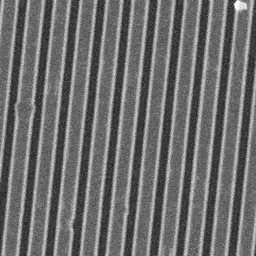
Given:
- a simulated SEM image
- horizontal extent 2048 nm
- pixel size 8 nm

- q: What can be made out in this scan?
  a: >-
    parallel lines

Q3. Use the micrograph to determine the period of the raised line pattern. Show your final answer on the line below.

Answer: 0.208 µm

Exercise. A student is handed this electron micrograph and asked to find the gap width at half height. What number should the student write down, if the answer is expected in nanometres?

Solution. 86.5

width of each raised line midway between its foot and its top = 123 nanometres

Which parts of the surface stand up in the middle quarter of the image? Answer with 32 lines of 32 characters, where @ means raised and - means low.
--@@@@---@@@@---@@@---@@@@---@@@
--@@@@---@@@@---@@@---@@@@---@@@
--@@@@---@@@@--@@@@---@@@@--@@@@
--@@@@---@@@---@@@@---@@@@--@@@@
--@@@@---@@@---@@@@---@@@---@@@@
--@@@@---@@@---@@@@---@@@---@@@@
--@@@@--@@@@---@@@@---@@@---@@@@
--@@@---@@@@---@@@@---@@@---@@@@
--@@@---@@@@---@@@@--@@@@---@@@-
--@@@---@@@@---@@@---@@@@---@@@-
-@@@@---@@@@---@@@---@@@@---@@@-
-@@@@---@@@@---@@@---@@@@---@@@-
-@@@@---@@@@--@@@@---@@@---@@@@-
-@@@@---@@@---@@@@---@@@---@@@@-
-@@@@---@@@---@@@@---@@@---@@@@-
-@@@@---@@@---@@@@---@@@---@@@@-
-@@@@--@@@@---@@@@---@@@---@@@@-
-@@@---@@@@---@@@@--@@@@---@@@@-
-@@@---@@@@---@@@---@@@@---@@@--
-@@@---@@@@---@@@---@@@@---@@@--
-@@@---@@@@---@@@---@@@@---@@@--
-@@@---@@@@--@@@@---@@@@--@@@@--
@@@@---@@@---@@@@---@@@---@@@@--
@@@@---@@@---@@@@---@@@---@@@@--
@@@@---@@@---@@@@---@@@---@@@@--
@@@@--@@@@---@@@@---@@@---@@@@--
@@@---@@@@---@@@@---@@@---@@@@--
@@@---@@@@---@@@@--@@@@---@@@@--
@@@---@@@@---@@@---@@@@---@@@---
@@@---@@@@---@@@---@@@@---@@@---
@@@---@@@@---@@@---@@@@---@@@---
@@@---@@@@--@@@@---@@@@--@@@@---